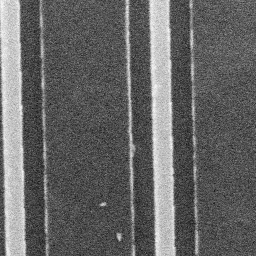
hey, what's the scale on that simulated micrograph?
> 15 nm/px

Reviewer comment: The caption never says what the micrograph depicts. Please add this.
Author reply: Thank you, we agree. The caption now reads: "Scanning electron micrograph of lines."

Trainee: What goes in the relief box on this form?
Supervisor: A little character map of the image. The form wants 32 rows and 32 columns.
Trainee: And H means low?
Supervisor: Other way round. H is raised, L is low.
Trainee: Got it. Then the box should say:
LHLLLHHHHHHHHHHHLLLHHLLLHHHHHHHH
LHLLLHHHHHHHHHHHLLLHHLLLHHHHHHHH
LHLLLHHHHHHHHHHHLLLHHLLLHHHHHHHH
LHLLLHHHHHHHHHHHLLLHHLLLHHHHHHHH
LHLLLHHHHHHHHHHHLLLHHLLLHHHHHHHH
LHLLLHHHHHHHHHHHLLLHHLLLHHHHHHHH
LHLLLHHHHHHHHHHHLLLHHLLLHHHHHHHH
LHLLLHHHHHHHHHHHLLLHHLLLHHHHHHHH
LHLLLHHHHHHHHHHHLLLHHLLLHHHHHHHH
LHHLLHHHHHHHHHHHLLLHHLLLHHHHHHHH
LHHLLHHHHHHHHHHHLLLHHLLLHHHHHHHH
LHHLLHHHHHHHHHHHLLLHHLLLHHHHHHHH
LHHLLHHHHHHHHHHHLLLLHLLLHHHHHHHH
LHHLLHHHHHHHHHHHLLLLHLLLHHHHHHHH
LHHLLHHHHHHHHHHHLLLLHLLLHHHHHHHH
LHHLLHHHHHHHHHHHLLLLHLLLHHHHHHHH
LHHLLLHHHHHHHHHHLLLLHLLLHHHHHHHH
LHHLLLHHHHHHHHHHLLLLHLLLHHHHHHHH
LHHLLLHHHHHHHHHHLLLLHLLLHHHHHHHH
LHHLLLHHHHHHHHHHLLLLHLLLHHHHHHHH
LHHLLLHHHHHHHHHHLLLLHLLLHHHHHHHH
LHHLLLHHHHHHHHHHLLLLHLLLHHHHHHHH
LHHLLLHHHHHHHHHHHLLLHHLLHHHHHHHH
LHHLLLHHHHHHHHHHHLLLHHLLHHHHHHHH
LHHLLLHHHHHHHHHHHLLLHHLLHHHHHHHH
LHHLLLHHHHHHHHHHHLLLHHLLHHHHHHHH
LHHLLLHHHHHHHHHHHLLLHHLLHHHHHHHH
LHHLLLHHHHHHHHHHHLLLHHLLLHHHHHHH
LHHLLLHHHHHHHHHHHLLLHHLLLHHHHHHH
LHHLLLHHHHHHHHHHHLLLHHLLLHHHHHHH
LHHLLLHHHHHHHHHHHLLLHHLLLHHHHHHH
LHHLLLHHHHHHHHHHHLLLHHLLLHHHHHHH